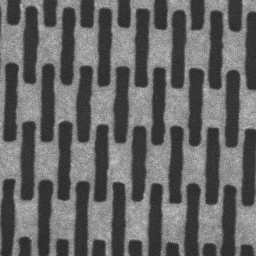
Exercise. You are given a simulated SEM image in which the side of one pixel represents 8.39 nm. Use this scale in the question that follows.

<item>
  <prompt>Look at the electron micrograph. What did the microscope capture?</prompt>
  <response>a regular array of holes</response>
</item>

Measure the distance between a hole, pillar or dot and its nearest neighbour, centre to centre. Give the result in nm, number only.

309